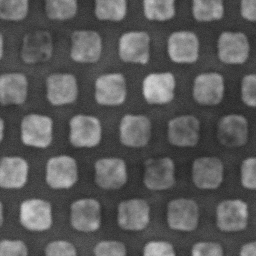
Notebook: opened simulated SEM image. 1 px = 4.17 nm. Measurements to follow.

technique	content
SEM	a regular array of raised bodies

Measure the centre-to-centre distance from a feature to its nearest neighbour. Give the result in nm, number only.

199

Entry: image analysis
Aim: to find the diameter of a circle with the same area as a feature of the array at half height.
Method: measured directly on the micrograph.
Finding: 0.132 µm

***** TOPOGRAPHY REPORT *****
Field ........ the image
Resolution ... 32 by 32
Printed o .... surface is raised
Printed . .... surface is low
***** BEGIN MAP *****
ooo...ooo...ooo...oooo..oooo..oo
ooo...ooo...oooo..oooo..oooo..oo
..............o..........oo.....
................................
...ooo...ooo....oo...ooo....oo..
...ooo...ooo...oooo..oooo..oooo.
...ooo...ooo...oooo..oooo..oooo.
...ooo....oo...ooo....oo....ooo.
................................
ooo...ooo....oo....oo....oo....o
ooo...ooo...oooo..oooo..oooo..oo
ooo...oooo..oooo..oooo..oooo..oo
ooo...ooo...ooo...ooo....ooo..oo
................................
....o........................o..
...ooo...ooo...oooo..oooo..oooo.
...ooo...ooo...oooo..oooo..oooo.
...ooo...ooo...ooo...oooo..oooo.
................................
................................
ooo...ooo...ooo...ooo...oooo..oo
ooo...ooo...oooo..ooo...oooo..oo
ooo...ooo...oooo..oooo..oooo..oo
.............o..................
................................
...ooo...ooo...ooo...ooo....oo..
...ooo...ooo...oooo..oooo..oooo.
...ooo...ooo...ooo...oooo..oooo.
...ooo...ooo...ooo.....o....oo..
................................
ooo...ooo...ooo....oo....oo....o
ooo...ooo...oooo..oooo..oooo..oo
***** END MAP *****